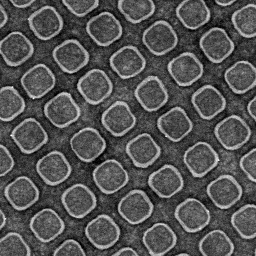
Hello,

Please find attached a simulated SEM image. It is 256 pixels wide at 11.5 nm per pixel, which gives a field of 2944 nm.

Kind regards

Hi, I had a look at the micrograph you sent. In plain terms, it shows a regular array of raised bodies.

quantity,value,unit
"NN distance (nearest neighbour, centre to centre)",453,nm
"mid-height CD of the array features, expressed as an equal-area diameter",357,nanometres